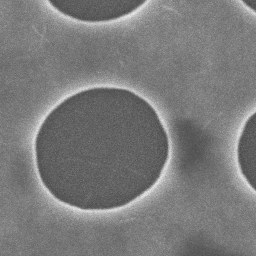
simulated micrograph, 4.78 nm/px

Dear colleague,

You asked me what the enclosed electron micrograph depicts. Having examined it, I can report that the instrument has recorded holes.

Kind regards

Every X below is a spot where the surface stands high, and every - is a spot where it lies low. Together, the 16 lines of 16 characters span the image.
XXX------XXXXXXX
XXXXXXXXXXXXXXXX
XXXXXXXXXXXXXXXX
XXXXXXXXXXXXXXXX
XXXXXXXXXXXXXXXX
XXXXXX-XXXXXXXXX
XXXX-----XXXXXXX
XXX-------XXXXX-
XX--------XXXXX-
XX---------XXXX-
XX--------XXXXX-
XXX-------XXXXXX
XXXX----XXXXXXXX
XXXXXXXXXXXXXXXX
XXXXXXXXXXXXXXXX
XXXXXXXXXXXXXXXX